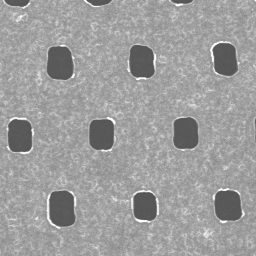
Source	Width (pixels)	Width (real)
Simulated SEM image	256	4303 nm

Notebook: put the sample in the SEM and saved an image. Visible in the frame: a regular array of holes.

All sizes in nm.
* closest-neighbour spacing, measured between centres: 1390